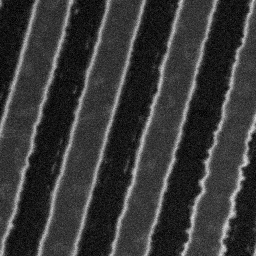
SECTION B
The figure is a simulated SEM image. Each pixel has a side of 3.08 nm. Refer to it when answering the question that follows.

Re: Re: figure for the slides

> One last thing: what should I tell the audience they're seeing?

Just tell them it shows one or a few lines or trenches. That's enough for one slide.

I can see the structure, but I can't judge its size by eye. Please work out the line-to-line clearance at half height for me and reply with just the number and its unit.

106 nanometres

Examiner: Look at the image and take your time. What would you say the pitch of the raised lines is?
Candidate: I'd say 215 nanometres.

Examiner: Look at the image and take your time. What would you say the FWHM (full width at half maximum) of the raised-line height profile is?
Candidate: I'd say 109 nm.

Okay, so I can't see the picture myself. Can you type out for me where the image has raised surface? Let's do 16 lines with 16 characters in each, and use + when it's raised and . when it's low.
..++...++..++...
..++..+++..++..+
..++..++...++..+
.+++..++..+++..+
.++...++..++...+
.++..+++..++..++
+++..++...++..++
++...++..+++..++
++..+++..++..+++
++..++...++..++.
++..++..+++..++.
+...++..++...++.
+..+++..++..+++.
+..++...++..++..
+..++..+++..++..
..+++..++...++..